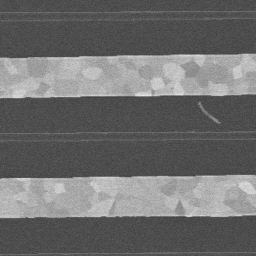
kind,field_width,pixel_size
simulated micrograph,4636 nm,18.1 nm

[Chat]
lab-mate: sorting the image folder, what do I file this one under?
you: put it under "lines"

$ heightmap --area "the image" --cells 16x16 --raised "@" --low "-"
----------------
----------------
----------------
----------------
@@@@@@@@@@@@@@@@
@@@@@@@@@@@@@@@@
----------------
----------------
----------------
----------------
----------------
@@@@@@@@@@@@@@@@
@@@@@@@@@@@@@@@@
@---------------
----------------
----------------